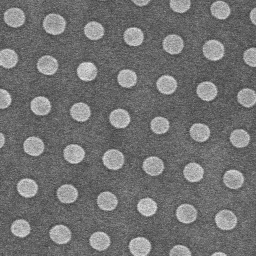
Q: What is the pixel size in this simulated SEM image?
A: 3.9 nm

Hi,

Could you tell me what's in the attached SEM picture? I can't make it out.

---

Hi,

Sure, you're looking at a regular array of raised bodies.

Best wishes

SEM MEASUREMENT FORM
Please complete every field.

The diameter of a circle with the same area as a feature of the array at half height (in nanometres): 75.3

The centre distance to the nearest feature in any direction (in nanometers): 157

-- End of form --